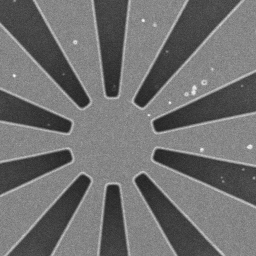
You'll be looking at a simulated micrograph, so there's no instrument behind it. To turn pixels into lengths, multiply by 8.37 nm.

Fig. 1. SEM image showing groups of lines, slits or small figures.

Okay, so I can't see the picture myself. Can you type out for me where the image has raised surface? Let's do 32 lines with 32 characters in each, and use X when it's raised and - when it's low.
----XXXXXXXX----XXXXXXX-------XX
-----XXXXXXX----XXXXXXX------XXX
------XXXXXX----XXXXXX------XXXX
X-----XXXXXX----XXXXXX-----XXXXX
XX-----XXXXX----XXXXX-----XXXXXX
XX-----XXXXX---XXXXXX----XXXXXXX
XXX-----XXXX---XXXXX----XXXXXXXX
XXXX----XXXXX--XXXX----XXXXXXXXX
XXXXX----XXXX--XXXX----XXXXXXXXX
XXXXXX----XXX--XXX----XXXXXXXXX-
XXXXXXX---XXX--XXX---XXXXXXXX---
-XXXXXXX---XX--XX---XXXXXXX-----
---XXXXXX--XXXXXX--XXXXXX-------
-----XXXXXXXXXXXXXXXXX----------
-------XXXXXXXXXXXXX----------XX
XX-------XXXXXXXXXX------XXXXXXX
XXXXXXX-XXXXXXXXXXXXXXXXXXXXXXXX
XXXXXXXXXXXXXXXXXXXXXXXXXXXXXXXX
XXXXXXXXXXXXXXXXXXXXXXXXXXXXXXXX
XXXX-----XXXXXXXXXX------XXXXXXX
--------XXXXXXXXXXXX----------XX
------XXXXXXXXXXXXXXXX----------
----XXXXX--XXXXXX--XXXXXX-------
--XXXXXXX--XX--XX---XXXXXXX-----
XXXXXXXX--XXX--XXX---XXXXXXXX---
XXXXXXX---XXX--XXX----XXXXXXXXX-
XXXXXX---XXXX--XXXX----XXXXXXXXX
XXXXX----XXXX--XXXXX----XXXXXXXX
XXXX----XXXXX---XXXX-----XXXXXXX
XXX-----XXXXX---XXXXX----XXXXXXX
XX-----XXXXX----XXXXX-----XXXXXX
X------XXXXX----XXXXXX-----XXXXX